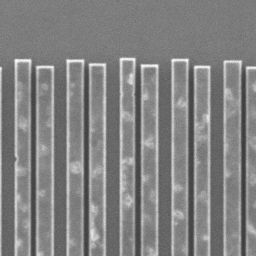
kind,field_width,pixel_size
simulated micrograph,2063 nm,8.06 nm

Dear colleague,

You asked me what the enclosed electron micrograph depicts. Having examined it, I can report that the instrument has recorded parallel lines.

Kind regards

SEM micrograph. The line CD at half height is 130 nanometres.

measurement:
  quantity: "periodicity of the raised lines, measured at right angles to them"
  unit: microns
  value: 0.211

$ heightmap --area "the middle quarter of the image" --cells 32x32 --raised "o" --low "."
.oooo..ooo....oooo..ooo....oooo.
.oooo..ooo....oooo..ooo....oooo.
.oooo..ooo....oooo..ooo....oooo.
.oooo..ooo....oooo..ooo....oooo.
.oooo..ooo....oooo..ooo....oooo.
.oooo..ooo....oooo..ooo....oooo.
.oooo..ooo....oooo..ooo....oooo.
.oooo..ooo....oooo..ooo....oooo.
.oooo..ooo....oooo..ooo....oooo.
.oooo..ooo....oooo..ooo....oooo.
.oooo..ooo....oooo..ooo....oooo.
.oooo..ooo....oooo..ooo....oooo.
.oooo..ooo....oooo..ooo....oooo.
.oooo..ooo....oooo..ooo....oooo.
.oooo..ooo....oooo..ooo....oooo.
.oooo..ooo....oooo..ooo....oooo.
.oooo..ooo....oooo..ooo....oooo.
.oooo..ooo....oooo..ooo....oooo.
.oooo..ooo....oooo..ooo....oooo.
.oooo..ooo....oooo..ooo....oooo.
.oooo..ooo....oooo..ooo....oooo.
.oooo..ooo....oooo..ooo....oooo.
.oooo..ooo....oooo..ooo....oooo.
.oooo..ooo....oooo..ooo....oooo.
.oooo..ooo....oooo..ooo....oooo.
.oooo..ooo....oooo..ooo....oooo.
.oooo..ooo....oooo..ooo....oooo.
.oooo..ooo....oooo..ooo....oooo.
.oooo..ooo....oooo..ooo....oooo.
.oooo..ooo....oooo..ooo....oooo.
.oooo..ooo....oooo..ooo....oooo.
.oooo..ooo....oooo..ooo....oooo.